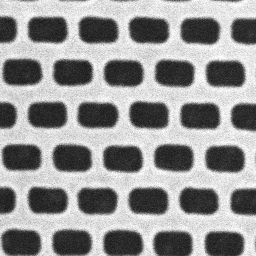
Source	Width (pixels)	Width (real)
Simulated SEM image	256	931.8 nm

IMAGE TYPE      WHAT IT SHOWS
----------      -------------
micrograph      a regular array of holes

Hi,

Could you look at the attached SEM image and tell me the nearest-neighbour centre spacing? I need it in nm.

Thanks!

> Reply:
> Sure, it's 180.